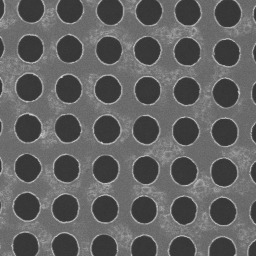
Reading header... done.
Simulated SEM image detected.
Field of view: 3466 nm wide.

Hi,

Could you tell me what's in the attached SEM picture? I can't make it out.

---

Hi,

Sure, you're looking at a regular array of holes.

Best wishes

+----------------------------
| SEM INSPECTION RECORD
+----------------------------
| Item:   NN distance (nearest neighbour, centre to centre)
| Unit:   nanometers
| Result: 528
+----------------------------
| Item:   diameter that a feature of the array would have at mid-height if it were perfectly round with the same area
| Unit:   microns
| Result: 0.364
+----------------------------